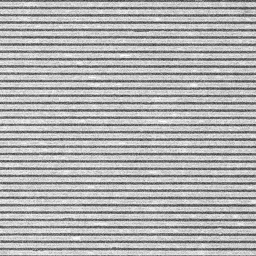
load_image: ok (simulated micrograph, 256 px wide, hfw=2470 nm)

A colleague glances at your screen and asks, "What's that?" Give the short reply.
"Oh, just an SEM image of parallel lines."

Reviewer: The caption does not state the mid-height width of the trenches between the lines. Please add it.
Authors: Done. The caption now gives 30.2 nanometers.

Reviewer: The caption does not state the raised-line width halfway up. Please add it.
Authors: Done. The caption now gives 0.0374 microns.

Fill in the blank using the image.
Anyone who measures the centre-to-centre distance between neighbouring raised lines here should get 70.5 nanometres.